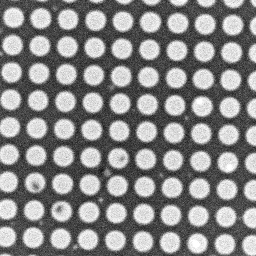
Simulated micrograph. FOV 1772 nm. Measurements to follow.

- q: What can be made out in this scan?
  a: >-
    an array of small figures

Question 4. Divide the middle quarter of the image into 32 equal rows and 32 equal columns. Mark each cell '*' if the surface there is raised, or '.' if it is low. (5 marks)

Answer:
**..............................
***...***....***....**.....**...
***..*****..*****..****...****..
***..*****..*****..****...****..
**....***...****...****...****..
.....................*.....**...
................................
**.....*........................
***..****...****...***....***...
***..****...****...****...****..
**...****...****...****..*****..
*.....***...****...****...****..
...........................**...
................................
*.....**........................
**...****...****...***....***...
**...****...****..*****..*****..
**...****...****..*****..*****..
*.....**....***....***....***...
...........................*....
................................
*.....**.....*..................
**...****...****..****....***...
**..*****..*****..*****..****...
**...****...****..*****..****...
......**....***....***....***...
................................
................................
*....***....***.................
**..*****..****...****...****...
**..*****..*****..****...****...
*....***...****...****...****...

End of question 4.